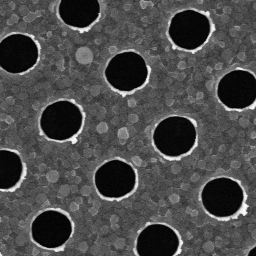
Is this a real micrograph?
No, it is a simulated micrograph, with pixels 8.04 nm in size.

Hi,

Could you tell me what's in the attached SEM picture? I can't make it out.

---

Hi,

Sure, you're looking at holes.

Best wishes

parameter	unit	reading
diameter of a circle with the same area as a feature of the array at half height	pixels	40.1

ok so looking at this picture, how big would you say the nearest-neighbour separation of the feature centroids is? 607 nm